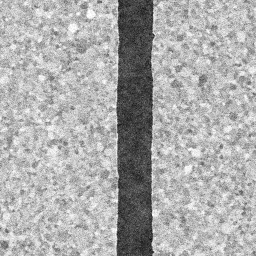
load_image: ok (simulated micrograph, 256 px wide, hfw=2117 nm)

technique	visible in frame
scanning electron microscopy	one or a few lines or trenches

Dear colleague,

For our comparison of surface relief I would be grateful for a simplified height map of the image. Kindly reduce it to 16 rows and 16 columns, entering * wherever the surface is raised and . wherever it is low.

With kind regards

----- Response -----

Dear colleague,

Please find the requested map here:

*******...******
*******...******
*******...******
*******..*******
*******...******
*******...******
*******...******
*******...******
*******...******
*******..*******
*******...******
*******...******
*******..*******
*******...******
*******...******
*******...******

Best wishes